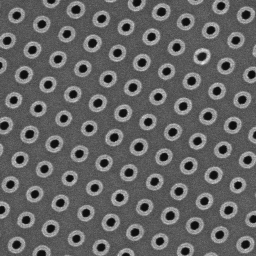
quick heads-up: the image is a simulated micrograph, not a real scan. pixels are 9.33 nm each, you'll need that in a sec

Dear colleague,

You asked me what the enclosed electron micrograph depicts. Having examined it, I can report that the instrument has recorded a regular array of ring-shaped raised bodies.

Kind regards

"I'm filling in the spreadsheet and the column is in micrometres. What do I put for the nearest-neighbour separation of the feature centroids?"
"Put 0.245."